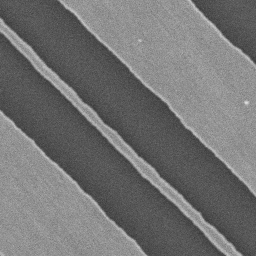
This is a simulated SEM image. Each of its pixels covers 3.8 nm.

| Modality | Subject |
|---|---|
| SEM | lines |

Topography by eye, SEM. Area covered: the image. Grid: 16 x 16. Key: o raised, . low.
....oooooooo....
.....oooooooo...
......oooooooo..
.......oooooooo.
........oooooooo
.........ooooooo
..........oooooo
o..........ooooo
oo..........oooo
ooo..........ooo
oooo..........oo
ooooo..........o
oooooo..........
ooooooo.........
oooooooo.....o..
ooooooooo.....o.